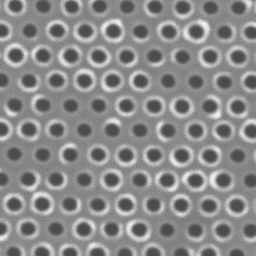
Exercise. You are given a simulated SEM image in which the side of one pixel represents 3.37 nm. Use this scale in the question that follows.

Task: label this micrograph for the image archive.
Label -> a regular array of holes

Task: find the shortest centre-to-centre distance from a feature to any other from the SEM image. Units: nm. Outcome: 92.8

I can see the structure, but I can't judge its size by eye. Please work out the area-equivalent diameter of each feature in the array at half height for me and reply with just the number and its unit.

47.9 nanometres